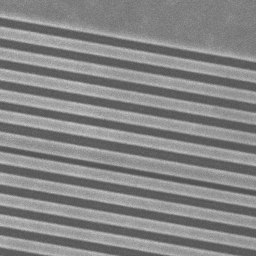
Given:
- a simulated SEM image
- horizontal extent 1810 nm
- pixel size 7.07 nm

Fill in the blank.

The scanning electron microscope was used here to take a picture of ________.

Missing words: parallel lines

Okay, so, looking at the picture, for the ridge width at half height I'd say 0.0792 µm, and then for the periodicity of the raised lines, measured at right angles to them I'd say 145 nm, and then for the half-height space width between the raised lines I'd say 0.067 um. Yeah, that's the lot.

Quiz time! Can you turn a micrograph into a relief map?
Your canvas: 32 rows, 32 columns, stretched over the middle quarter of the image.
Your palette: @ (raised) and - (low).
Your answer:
@@@@@@@@@----------------@@@@@@@
-@@@@@@@@@@@@@@----------------@
------@@@@@@@@@@@@@@@-----------
------------@@@@@@@@@@@@@@@-----
@@----------------@@@@@@@@@@@@@@
@@@@@@@@----------------@@@@@@@@
@@@@@@@@@@@@@@---------------@@@
-----@@@@@@@@@@@@@@-------------
-----------@@@@@@@@@@@@@@-------
@----------------@@@@@@@@@@@@@@-
@@@@@@@---------------@@@@@@@@@@
@@@@@@@@@@@@----------------@@@@
----@@@@@@@@@@@@@@--------------
----------@@@@@@@@@@@@@@--------
@--------------@@@@@@@@@@@@@@@--
@@@@@@@--------------@@@@@@@@@@@
@@@@@@@@@@@@---------------@@@@@
--@@@@@@@@@@@@@@@@--------------
--------@@@@@@@@@@@@@@@@--------
--------------@@@@@@@@@@@@@@@@--
@@@@----------------@@@@@@@@@@@@
@@@@@@@@@@---------------@@@@@@@
@@@@@@@@@@@@@@@----------------@
---@@@@@@@@@@@@@@@@@@-----------
--------@@@@@@@@@@@@@@@@@@@-----
@@@@----------@@@@@@@@@@@@@@@@@@
@@@@@@@@@@----------@@@@@@@@@@@@
@@@@@@@@@@@@@@@-----------@@@@@@
-----@@@@@@@@@@@@@@@@----------@
-----------@@@@@@@@@@@@@@@@-----
@@@--------------@@@@@@@@@@@@@@@
@@@@@@@@---------------@@@@@@@@@